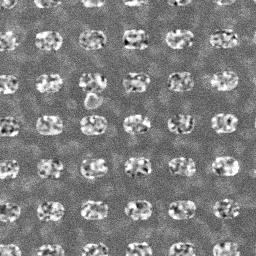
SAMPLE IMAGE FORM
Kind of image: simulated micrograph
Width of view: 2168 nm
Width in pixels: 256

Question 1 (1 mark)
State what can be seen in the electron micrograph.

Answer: a regular array of raised bodies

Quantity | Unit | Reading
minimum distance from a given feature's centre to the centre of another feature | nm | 359